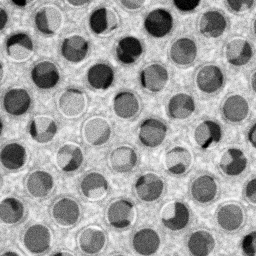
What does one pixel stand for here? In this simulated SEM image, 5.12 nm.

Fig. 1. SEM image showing a regular array of raised bodies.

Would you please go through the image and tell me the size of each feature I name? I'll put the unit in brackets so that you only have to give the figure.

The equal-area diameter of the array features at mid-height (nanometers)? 149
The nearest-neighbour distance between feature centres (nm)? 195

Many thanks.